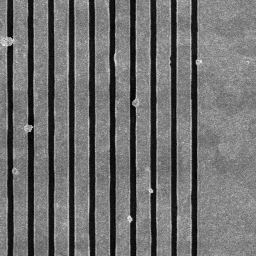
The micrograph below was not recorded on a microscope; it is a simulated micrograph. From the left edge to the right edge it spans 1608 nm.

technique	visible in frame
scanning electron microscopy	parallel lines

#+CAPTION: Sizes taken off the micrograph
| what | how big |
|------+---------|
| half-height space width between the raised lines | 40.8 nm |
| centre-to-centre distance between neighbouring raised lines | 128 nm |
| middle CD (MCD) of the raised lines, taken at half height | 88.7 nanometers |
